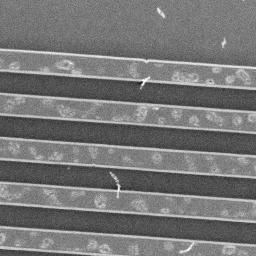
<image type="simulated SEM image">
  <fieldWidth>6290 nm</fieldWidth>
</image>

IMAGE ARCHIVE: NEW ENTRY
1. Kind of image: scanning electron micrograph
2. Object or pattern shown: parallel lines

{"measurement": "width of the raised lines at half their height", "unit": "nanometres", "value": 508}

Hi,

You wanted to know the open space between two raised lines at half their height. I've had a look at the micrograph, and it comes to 579 nanometers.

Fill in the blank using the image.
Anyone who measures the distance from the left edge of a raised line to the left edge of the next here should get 1.09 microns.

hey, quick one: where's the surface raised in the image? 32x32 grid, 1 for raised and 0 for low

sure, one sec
00000000000000000000000000000000
00000000000000000000000000000000
00000000000000000000000000000000
00000000000000000000000000000000
00000000000000000000000000000000
00000000000000000000000000000000
11100000000000000000000000000000
11111111111111111000000000000000
11111111111111111111111111111110
00000000001111111111111111111111
00000000000000000000000111111111
00000000000000000000000000000000
11111111110000000000000000000000
11111111111111111111111000000000
00101111111111111111111111111111
00000000000000000011111111111111
00000000000000000000000000000011
11110000000000000000000000000000
11111111111111110000000000000000
11111111111111111111111111111110
00000000001111111111111111111111
00000000000000000000001111111111
00000000000000000000000000000000
11111111100000000000000000000000
11111111111111111111110000000000
00111111111111111111111111111111
00000000000000011111111111111111
00000000000000000000000000000111
10000000000000000000000000000000
11111111111111110000000000000000
11111111111111111111111111110000
00000000111111111111111111111111